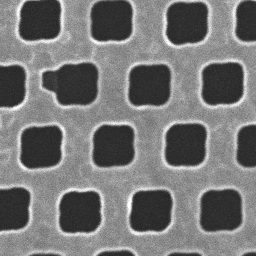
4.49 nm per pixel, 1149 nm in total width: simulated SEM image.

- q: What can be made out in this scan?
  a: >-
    a regular array of holes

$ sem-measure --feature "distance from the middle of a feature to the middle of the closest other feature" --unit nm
317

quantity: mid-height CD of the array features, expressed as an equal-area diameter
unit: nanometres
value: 207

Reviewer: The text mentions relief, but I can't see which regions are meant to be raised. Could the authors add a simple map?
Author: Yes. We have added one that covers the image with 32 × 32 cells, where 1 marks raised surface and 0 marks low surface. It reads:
11100000111100001111110000111100
11000000111000000111100000111000
11000000111000000111100000111000
11000000111000000111100000111000
11000001111000001111100000111100
11111111111111111111110011111111
11111111111111111111111111111111
11111111111111111111111111111111
00011110000011111000011111000011
00011000000011110000011110000001
00011000000011110000011110000001
00011100000011110000011110000011
00011110000011110000011110000011
01111111111111111111111111111111
11111111111111111111111111111111
11111111111110111111110001111111
11100000111100000111100000111100
11000000111100000111100000111100
11100000111100000111100000111100
11000000111000000111100000111000
11100001111100001111100001111100
11111111111111111111111111111111
11111111111111111111111111111111
10011111111111111111111111111111
00001111000011111000011110000011
00001110000001110000001110000011
00001110000001110000011110000011
00001110000001110000011110000011
00011111000011110000011110000011
11111111111111111111111111111111
11111111111111111111111111111111
11111111111110001111111111111110